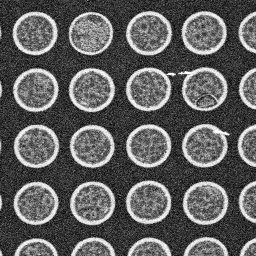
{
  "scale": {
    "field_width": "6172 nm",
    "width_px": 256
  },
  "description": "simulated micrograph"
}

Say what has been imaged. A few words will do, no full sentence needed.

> a regular array of raised bodies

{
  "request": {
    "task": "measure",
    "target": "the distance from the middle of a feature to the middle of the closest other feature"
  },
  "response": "1350 nm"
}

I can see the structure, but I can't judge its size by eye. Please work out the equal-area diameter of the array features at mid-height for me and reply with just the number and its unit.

976 nm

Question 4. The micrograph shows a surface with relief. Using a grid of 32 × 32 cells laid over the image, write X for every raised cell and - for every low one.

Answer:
--------------------------------
--------------------------------
---XXX----XXX----XXX----XXX----X
--XXXXX--XXXXX--XXXXX--XXXXX--XX
--XXXXX--XXXXX--XXXXX--XXXXX--XX
--XXXX----XXX----XXXX--XXXXX---X
----X------X------X-------------
--------------------------------
--------------------------------
---XXX----XXX----XXX----XXX----X
--XXXXX--XXXXX--XXXXX--XXXXX--XX
--XXXXX--XXXXX--XXXXX--XXXXX--XX
--XXXXX--XXXXX--XXXXX--XXXXX---X
----X-----XX------X------X------
--------------------------------
--------------------------------
---XXX----XXX----XXX----XXX----X
--XXXXX--XXXXX--XXXXX--XXXXX--XX
--XXXXX--XXXXX--XXXXX--XXXXX--XX
--XXXXX--XXXXX--XXXXX--XXXXX--XX
---XXX-----X------X------X------
--------------------------------
--------------------------------
---XXX----XXX----XXX----XXX----X
--XXXXX--XXXXX--XXXXX--XXXXX--XX
--XXXXX--XXXXX--XXXXX--XXXXX--XX
--XXXXX--XXXXX--XXXXX--XXXXX--XX
---XXX----XXX-----X-----XXX-----
--------------------------------
--------------------------------
---XXX----XXX----XXX----XXX----X
--XXXXX--XXXXX--XXXXX--XXXXX--XX